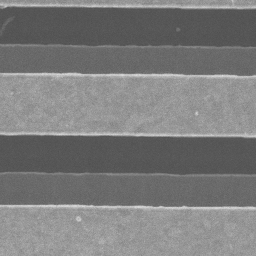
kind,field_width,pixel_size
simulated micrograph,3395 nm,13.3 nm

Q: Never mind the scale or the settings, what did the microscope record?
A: lines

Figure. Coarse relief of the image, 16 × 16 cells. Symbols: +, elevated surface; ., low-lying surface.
..............++
................
................
++++++++++++++++
++++++++++++++++
++++++++++++++++
++++++++++++++++
++++++++++++++++
...........+++++
................
................
++++++++++++++++
++++++++++++++++
++++++++++++++++
++++++++++++++++
++++++++++++++++